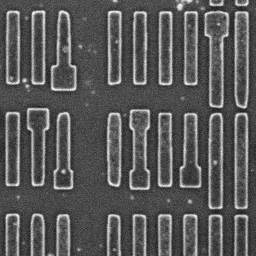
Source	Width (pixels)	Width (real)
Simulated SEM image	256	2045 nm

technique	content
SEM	wiring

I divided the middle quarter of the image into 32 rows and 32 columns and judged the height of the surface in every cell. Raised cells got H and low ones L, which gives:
HHLLLLLLLLLHHHLLLLHHLLLLHHHLLLHH
HHHLLLLLLLLHHHLLLLHHLLLLHHHLLLHH
HHHLLLLLLLLHHHLLLLHHLLLLHHHLLLHH
HHHLLLLLLLLHHHLLLLHHLLLLHHHLLLHH
HHHLLLLLLLLHHHLLLLHHLLLLHHHLLLHH
HHHLLLLLLLLLLLLLLLLLLLLLLLLLLLLL
LLLLLLLLLLLLLLLLLLLLLLLLLLLLLLLL
LLLLLLLLLLLLLLLLLLLLLLLLLLLLLLLL
LLLLLLLLLLLLLLLLLLLLLLLLLLLLLLLL
LLLLLLLLLLLLLLLLLLLLLLLLLLLLLLLL
LLLLLLLLLLLLLLLLLLLLLLLLLLLLLLLL
LLLLLLLLLLLLLLLLLLLLLLLLLLLLLLLL
HLLLLLLLLLLLLLLLLHHHHLLLLLLLLLLL
HLLLLLLLLLLHHHLLLHHHHLLLHHHLLLHH
HLLLLLLLLLLHHHLLLHHHHLLLHHHLLLHH
HLLLLLLLLLLHHHLLLHHHHLLLHHHLLLHH
HLLLLLLLLLLHHHLLLHHHHLLLHHHLLLHH
HLLLLLLLLLLHHHLLLLHHLLLLHHHLLLHH
HLLLLLLLLLLHHHLLLLHHLLLLHHHLLLHH
HLLLLLLLLLLHHHLLLLHHLLLLHHHLLLHH
HLLLLLLLLLLHHHLLLLHHLLLLHHHLLLHH
HLLLLLLLLLLHHHLLLLHHLLLLHHHLLLHH
HLLLLLLLLLLHHHLLLLHHLLLLHHHLLLHH
HLLLLLLLLLLHHHLLLLHHLLLLHHHLLLHH
HLLLLLLLLLLHHHLLLLHHLLLLHHHLLLHH
HLLLLLLLLLLHHHLLLLHHLLLLHHHLLLHH
HHLLLLLLLLLHHHLLLHHHHLLLHHHLLHHH
HHLLLLLLLLLHHHLLLHHHHLLLHHHLLHHH
HHLLLLLLLLLHHHLLLHHHHLLLHHHLLHHH
HHLLLLLLLLLHHHLLLHHHHLLLHHHLLHHH
HHLLLLLLLLLLLLLLLHHHHLLLLLLLLHHH
LLLLLLLLLLLLLLLLLLLLLLLLLLLLLLLL